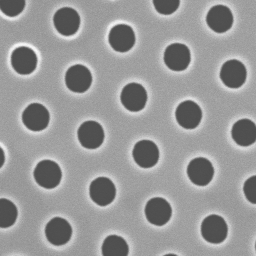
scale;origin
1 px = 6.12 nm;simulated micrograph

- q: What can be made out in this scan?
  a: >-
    a regular array of holes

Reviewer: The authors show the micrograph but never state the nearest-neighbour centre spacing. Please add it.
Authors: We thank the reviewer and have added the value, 0.351 microns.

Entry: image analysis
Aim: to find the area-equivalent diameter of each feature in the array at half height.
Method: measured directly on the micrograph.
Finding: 173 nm